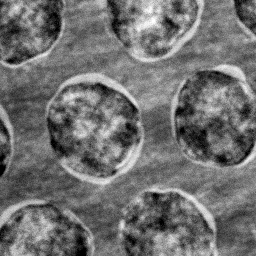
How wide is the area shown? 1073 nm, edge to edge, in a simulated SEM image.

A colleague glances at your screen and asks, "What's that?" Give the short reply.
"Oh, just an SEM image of holes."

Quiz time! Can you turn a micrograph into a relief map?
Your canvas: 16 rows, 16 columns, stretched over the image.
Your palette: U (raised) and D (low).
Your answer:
DDDDUUUDDDDDUUUD
DDDDUUUDDDDDUUUD
DDDDUUUDDDDUUUUU
DDUUUUUUUDUUUUUU
UUUUUUUUUUUUDDUU
UUUUDDDUUUUDDDDD
UUUDDDDDUUUDDDDD
UUUDDDDDDUUDDDDD
DUUDDDDDDUUDDDDD
DUUDDDDDDUUDDDDD
UUUUDDDDUUUUUUUU
UUUUUUUUUUUUUUUU
UUUUUUUUDDDDUUUU
UDDDDUUUDDDDDUUU
DDDDDUUDDDDDDUUU
DDDDDDUUDDDDDUUU